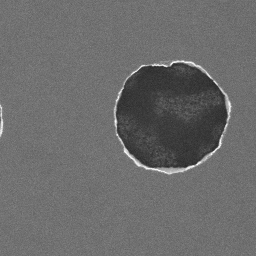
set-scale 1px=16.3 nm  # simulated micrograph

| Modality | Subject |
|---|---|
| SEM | holes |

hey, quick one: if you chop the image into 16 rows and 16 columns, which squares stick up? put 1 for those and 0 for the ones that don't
1111111111111111
1111111111111111
1111111111111111
1111111111111111
1111111100000111
1111111100000011
1111111000000011
1111111000000011
1111111000000011
1111111100000111
1111111111011111
1111111111111111
1111111111111111
1111111111111111
1111111111111111
1111111111111111